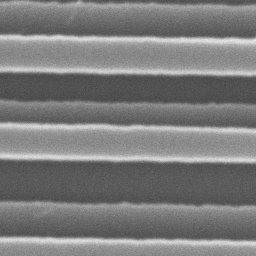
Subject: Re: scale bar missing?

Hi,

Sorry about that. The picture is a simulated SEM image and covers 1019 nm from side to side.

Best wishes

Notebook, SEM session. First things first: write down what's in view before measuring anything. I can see lines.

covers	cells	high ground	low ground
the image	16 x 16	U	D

DDDDDDDDDDDDDDDD
DDDDDDDDDDDDDDDD
UUUUUUUUUUUUUUUU
UUUUUUUUUUUUUUUU
DDDUUUUUUUUUUUUU
DDDDDDDDDDDDDDDD
DDDDDDDDDDDDDDDD
DDDDDDDDDDDDDDDD
UUUUUUUUUUUUUUUU
UUUUUUUUUUUUUUUU
DDDDDDDDDDDDDDDD
DDDDDDDDDDDDDDDD
DDDDDDDDDDDDDDDD
DDDDDDDDDDDDDDDD
DDDDDDDDDDDDDDDD
UUUUUUUUUUUUUUUU